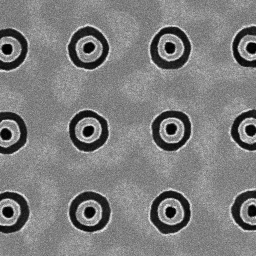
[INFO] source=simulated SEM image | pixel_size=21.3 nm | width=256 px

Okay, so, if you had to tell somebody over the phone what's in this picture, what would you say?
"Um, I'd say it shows ring-shaped grooves with a dot in the middle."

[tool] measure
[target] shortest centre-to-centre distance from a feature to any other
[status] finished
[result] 80.3 px